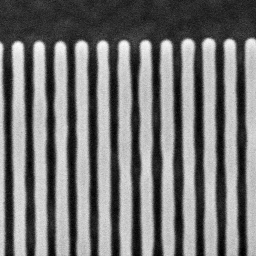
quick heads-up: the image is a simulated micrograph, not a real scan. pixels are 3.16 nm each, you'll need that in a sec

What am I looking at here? groups of lines, slits or small figures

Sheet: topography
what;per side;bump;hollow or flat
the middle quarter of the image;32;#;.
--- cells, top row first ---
#..###...##...##...###..###...##
#..###...##...##...###..###...##
#..###...##...###..###..###...##
#..###...##...###..###..###...##
#..###...##...###..###..###...##
#..###...##...###..###..###...##
#..###..###...###..###..###...##
#..###..###...###..###..###...##
#..###..###...###..###..###...##
#..###...##...###..###..###...##
#..###...##...###..###..###...##
#..###...##...###..###..###...##
#..###...##...###..###..###...##
#..###...##...###..###..###...##
#..###...##...###..###..###...##
#..###...##...###..###..###...##
#..###...##...###..###..####..##
#..###...##...###..###..####..##
#..###...##...###..###..####..##
#...##...##...###..###..###...##
#..###...###..###..###..###...##
#..###...###..###..###...##...##
#..###...###..###..###...##...##
#..###...###..###..###...##...##
#..###...###..###..###...##...##
#..###...###..###...##...##...##
#..###...###..###...##...##...##
#..###...###..###..###...##...##
#..###...###..###..###...##...##
#..###...###..###..###...##...##
#..###...###..###..###...##...##
#..###...###..###..###...##...##